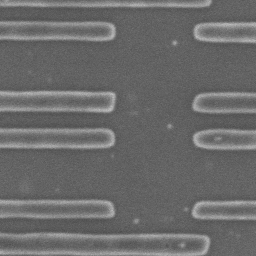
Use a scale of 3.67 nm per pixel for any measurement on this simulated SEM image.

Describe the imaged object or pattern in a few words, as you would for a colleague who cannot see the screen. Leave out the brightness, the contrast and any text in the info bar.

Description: wiring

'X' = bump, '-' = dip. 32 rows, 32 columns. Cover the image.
XXXXXXXXXXXXXXXXXXXXXXXXXX------
--------------------------------
--------------------------------
XXXXXXXXXXXXXX----------XXXXXXXX
XXXXXXXXXXXXXX----------XXXXXXXX
--------------------------------
--------------------------------
--------------------------------
--------------------------------
--------------------------------
--------------------------------
--------------------------------
XXXXXXXXXXXXXX----------XXXXXXXX
XXXXXXXXXXXXXX----------XXXXXXXX
--------------------------------
--------------------------------
XXXXXXXXXXXXXX-----------XXXXXXX
XXXXXXXXXXXXXX----------XXXXXXXX
--------------------------XXXXXX
--------------------------------
--------------------------------
--------------------------------
--------------------------------
--------------------------------
--------------------------------
XXXXXXXXXXXXXX-----------XXXXXXX
XXXXXXXXXXXXXX----------XXXXXXXX
--------------------------------
--------------------------------
XXXXXXXXXXXXXXXXXXXXXXXXXX------
XXXXXXXXXXXXXXXXXXXXXXXXXX------
XXXXXXXXXXXXXXXXXXXXXXXXXX------